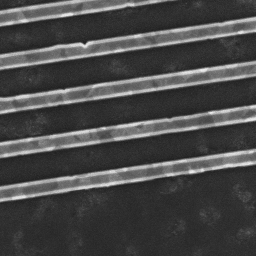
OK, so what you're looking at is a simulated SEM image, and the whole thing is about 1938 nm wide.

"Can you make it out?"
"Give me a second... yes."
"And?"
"parallel lines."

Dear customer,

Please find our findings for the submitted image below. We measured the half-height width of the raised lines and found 12.1 px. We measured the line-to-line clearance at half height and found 30.8 pixels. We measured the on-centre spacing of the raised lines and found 329 nanometers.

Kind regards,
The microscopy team